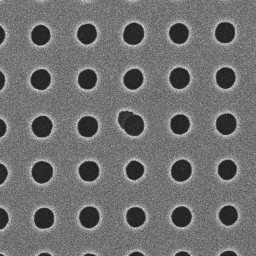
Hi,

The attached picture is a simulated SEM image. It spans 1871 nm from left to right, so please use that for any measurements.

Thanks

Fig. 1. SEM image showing a regular array of holes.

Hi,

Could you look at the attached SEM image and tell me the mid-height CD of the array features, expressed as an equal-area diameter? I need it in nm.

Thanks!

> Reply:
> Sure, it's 151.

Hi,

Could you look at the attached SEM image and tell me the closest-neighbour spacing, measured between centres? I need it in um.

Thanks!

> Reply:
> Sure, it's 0.331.